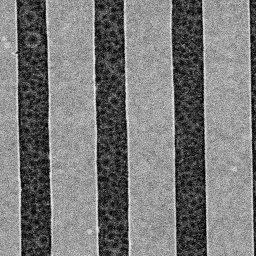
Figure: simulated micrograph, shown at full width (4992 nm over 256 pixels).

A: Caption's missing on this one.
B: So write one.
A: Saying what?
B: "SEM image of one or a few lines or trenches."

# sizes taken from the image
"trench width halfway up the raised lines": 612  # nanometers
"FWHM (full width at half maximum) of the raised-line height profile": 889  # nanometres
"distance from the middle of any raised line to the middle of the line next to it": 77.7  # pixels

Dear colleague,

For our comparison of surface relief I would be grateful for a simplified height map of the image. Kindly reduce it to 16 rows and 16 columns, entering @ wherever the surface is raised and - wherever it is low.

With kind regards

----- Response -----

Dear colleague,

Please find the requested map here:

@--@@@--@@@--@@@
@--@@@--@@@--@@@
@--@@@--@@@--@@@
@--@@@--@@@--@@@
@--@@@--@@@--@@@
@--@@@--@@@--@@@
@--@@@--@@@--@@@
@--@@@--@@@--@@@
@--@@@--@@@--@@@
@--@@@--@@@--@@@
@--@@@--@@@--@@@
@--@@@--@@@--@@@
@--@@@--@@@--@@@
@--@@@--@@@--@@@
@--@@@--@@@--@@@
@--@@@--@@@--@@@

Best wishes